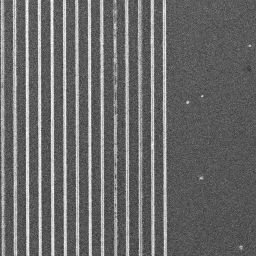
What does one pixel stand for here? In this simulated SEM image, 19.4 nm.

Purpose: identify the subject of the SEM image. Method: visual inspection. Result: parallel lines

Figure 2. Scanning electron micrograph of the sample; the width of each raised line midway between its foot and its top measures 36.3 nm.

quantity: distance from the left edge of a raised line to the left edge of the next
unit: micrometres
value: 0.241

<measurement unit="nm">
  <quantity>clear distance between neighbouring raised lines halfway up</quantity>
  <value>206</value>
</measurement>